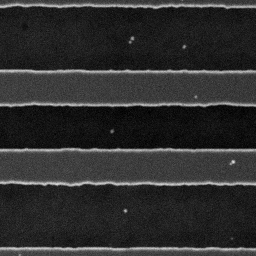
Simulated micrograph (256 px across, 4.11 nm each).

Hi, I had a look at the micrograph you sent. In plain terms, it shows lines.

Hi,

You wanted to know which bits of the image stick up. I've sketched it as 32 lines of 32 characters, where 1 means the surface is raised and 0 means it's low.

11111111111111111111111111111111
00000000000000000000000000000000
00000000000000000000000000000000
00000000000000000000000000000000
00000000000000000000000000000000
00000000000000000000000000000000
00000000000000000000000000000000
00000000000000000000000000000000
00000000000000000000000000000000
11111111111111111111111111111111
11111111111111111111111111111111
11111111111111111111111111111111
11111111111111111111111111111111
00000000000000000000000000000000
00000000000000000000000000000000
00000000000000000000000000000000
00000000000000000000000000000000
00000000000000000000000000000000
00000000000000000000000000000000
11111111111111111111111111111111
11111111111111111111111111111111
11111111111111111111111111111111
11111111111111111111111111111111
00000000000000000000000000000000
00000000000000000000000000000000
00000000000000000000000000000000
00000000000000000000000000000000
00000000000000000000000000000000
00000000000000000000000000000000
00000000000000000000000000000000
00000000000000000000000000000000
11111111111111111111111111111111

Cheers